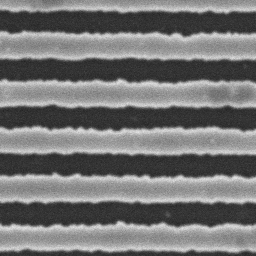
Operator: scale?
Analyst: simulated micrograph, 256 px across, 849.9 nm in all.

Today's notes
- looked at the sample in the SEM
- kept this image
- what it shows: lines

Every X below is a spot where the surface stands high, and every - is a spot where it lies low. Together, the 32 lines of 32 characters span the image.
XXXXXXXXXXXXXXXXXXXXXXXXXXXXXXXX
---------------X--------X--XX---
--------------------------------
--------------------------------
XXXXXXXXXXXXXXXXXXXXXXX-XXXXXXXX
XXXXXXXXXXXXXXXXXXXXXXXXXXXXXXXX
XXXXXXXXXXXXXXXXXXXXXXXXXXXXXXXX
--------------------------------
--------------------------------
--------------------------------
XXXXXXXXXXXXXXXXXXXXXXXXXXXXXXXX
XXXXXXXXXXXXXXXXXXXXXXXXXXXXXXXX
XXXXXXXXXXXXXXXXXXXXXXXXXXXXXXXX
--------------------------------
--------------------------------
--------------------------------
XXXXXXXXXXXXXXXXXXXXXXXXXXXXXXXX
XXXXXXXXXXXXXXXXXXXXXXXXXXXXXXXX
XXXXXXXXXXXXXXXXXXXXXXXXXXXXXXXX
--------------------------------
--------------------------------
--------------------------------
XXXXXXXXXXXXXXXXXXXXXXXXXXXXXXXX
XXXXXXXXXXXXXXXXXXXXXXXXXXXXXXXX
XXXXXXXXXXXXXXXXXXXXXXXXXXXXXXXX
--------------------------------
--------------------------------
--------------------------------
XXXXXXXXXXXXXXXXXXXXXXXXXXXXXXXX
XXXXXXXXXXXXXXXXXXXXXXXXXXXXXXXX
XXXXXXXXXXXXXXXXXXXXXXXXXXXXXXXX
--------------------------------